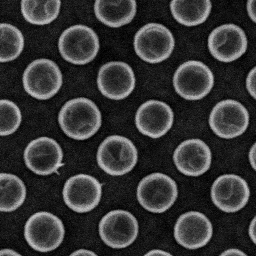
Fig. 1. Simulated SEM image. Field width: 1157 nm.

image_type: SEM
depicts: a regular array of raised bodies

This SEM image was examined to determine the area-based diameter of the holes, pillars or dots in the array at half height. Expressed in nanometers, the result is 163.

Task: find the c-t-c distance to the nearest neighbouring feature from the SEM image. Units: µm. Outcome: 0.232